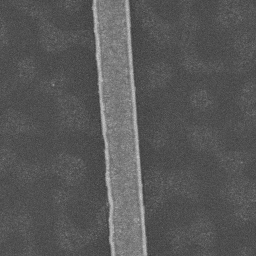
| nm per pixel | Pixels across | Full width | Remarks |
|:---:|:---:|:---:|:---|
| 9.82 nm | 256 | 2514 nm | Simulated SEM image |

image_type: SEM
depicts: one or a few lines or trenches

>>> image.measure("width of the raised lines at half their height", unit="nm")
309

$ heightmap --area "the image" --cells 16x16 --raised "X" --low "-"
------XX--------
------XX--------
------XX--------
------XX--------
------XX--------
------XX--------
------XX--------
------XX--------
-------XX-------
-------XX-------
-------XX-------
-------XX-------
-------XX-------
-------XX-------
-------XX-------
-------XX-------